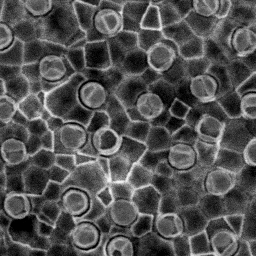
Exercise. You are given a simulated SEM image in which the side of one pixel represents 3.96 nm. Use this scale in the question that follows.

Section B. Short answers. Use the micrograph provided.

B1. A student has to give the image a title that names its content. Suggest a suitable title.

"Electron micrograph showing a regular array of raised bodies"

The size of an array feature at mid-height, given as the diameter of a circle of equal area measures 0.0876 microns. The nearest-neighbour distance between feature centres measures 119 nanometres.